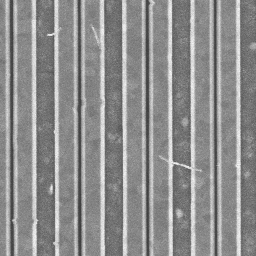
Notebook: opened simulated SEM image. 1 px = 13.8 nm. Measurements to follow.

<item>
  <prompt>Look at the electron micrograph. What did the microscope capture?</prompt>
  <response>parallel lines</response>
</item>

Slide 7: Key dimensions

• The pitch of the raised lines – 470 nanometers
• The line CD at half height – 284 nm